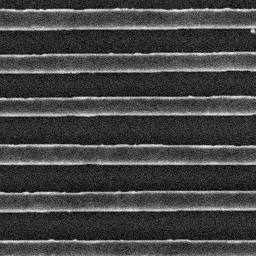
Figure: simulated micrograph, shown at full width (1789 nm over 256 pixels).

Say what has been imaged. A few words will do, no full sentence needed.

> lines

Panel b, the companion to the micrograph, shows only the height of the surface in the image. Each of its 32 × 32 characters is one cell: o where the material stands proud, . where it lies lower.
................................
oooooooooooooooooooooooooooooooo
oooooooooooooooooooooooooooooooo
ooooooooooooooooooo.............
................................
................................
................................
oooooooooooooooooooooooooooooooo
oooooooooooooooooooooooooooooooo
................................
................................
................................
oooooooooooooooooooooooooooooooo
oooooooooooooooooooooooooooooooo
................................
................................
................................
................................
oooooooooooooooooooooooooooooooo
oooooooooooooooooooooooooooooooo
..o.oooo.....oooooo..ooooooooooo
................................
................................
................................
oooooooooooooooooooooooooooooooo
oooooooooooooooooooooooooooooooo
................................
................................
................................
................................
oooooooooooooooooooooooooooooooo
oooooooooooooooooooooooooooooooo